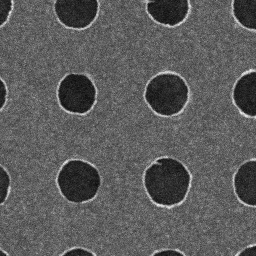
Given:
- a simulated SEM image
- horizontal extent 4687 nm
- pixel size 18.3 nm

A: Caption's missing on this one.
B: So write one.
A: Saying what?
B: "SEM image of holes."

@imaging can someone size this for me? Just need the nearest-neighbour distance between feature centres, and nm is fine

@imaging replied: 1600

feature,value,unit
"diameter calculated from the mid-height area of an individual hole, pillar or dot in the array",782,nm